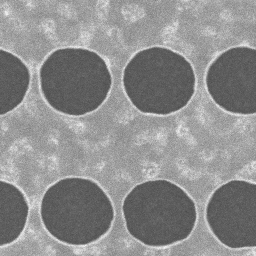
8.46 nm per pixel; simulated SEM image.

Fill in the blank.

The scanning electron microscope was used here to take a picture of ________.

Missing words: holes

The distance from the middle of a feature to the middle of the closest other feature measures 705 nanometres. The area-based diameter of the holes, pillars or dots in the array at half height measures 591 nm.